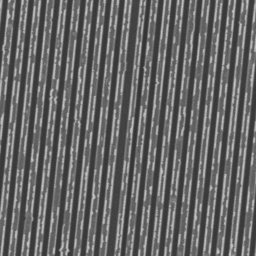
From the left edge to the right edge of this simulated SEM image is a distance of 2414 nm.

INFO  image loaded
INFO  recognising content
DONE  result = parallel lines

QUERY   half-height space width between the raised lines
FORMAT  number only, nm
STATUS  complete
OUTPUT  50.4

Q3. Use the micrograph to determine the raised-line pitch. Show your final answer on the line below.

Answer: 122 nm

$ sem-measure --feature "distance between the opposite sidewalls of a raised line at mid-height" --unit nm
68